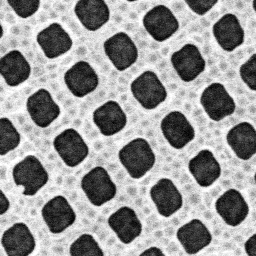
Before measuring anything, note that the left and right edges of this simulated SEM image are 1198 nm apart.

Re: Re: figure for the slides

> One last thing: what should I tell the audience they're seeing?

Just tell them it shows a regular array of holes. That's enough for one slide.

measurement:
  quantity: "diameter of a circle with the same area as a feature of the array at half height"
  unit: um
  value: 0.164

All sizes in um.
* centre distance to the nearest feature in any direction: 0.225